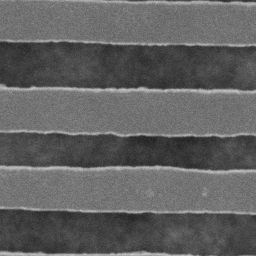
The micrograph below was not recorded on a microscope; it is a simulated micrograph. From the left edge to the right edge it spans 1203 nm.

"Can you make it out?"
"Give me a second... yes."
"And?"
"lines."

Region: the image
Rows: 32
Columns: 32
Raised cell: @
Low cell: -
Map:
@@@@@@@@@@@@@@@@@@@@@@@@@@@@@@@@
@@@@@@@@@@@@@@@@@@@@@@@@@@@@@@@@
@@@@@@@@@@@@@@@@@@@@@@@@@@@@@@@@
@@@@@@@@@@@@@@@@@@@@@@@@@@@@@@@@
@@@@@@@@@@@@@@@@@@@@@@@@@@@@@@@@
--------------@@@@@@@@@@@@@@@@@@
--------------------------------
--------------------------------
--------------------------------
--------------------------------
--------------------------------
@@@@@@@@@@@@@@@@@@@@@@@@@@@@@@@@
@@@@@@@@@@@@@@@@@@@@@@@@@@@@@@@@
@@@@@@@@@@@@@@@@@@@@@@@@@@@@@@@@
@@@@@@@@@@@@@@@@@@@@@@@@@@@@@@@@
@@@@@@@@@@@@@@@@@@@@@@@@@@@@@@@@
----@@@@@@@@@@@@@@@@@@@@@@@@@@@@
--------------------------------
--------------------------------
--------------------------------
--------------------------------
@@@@@@@@@@@@@@@@@@@@@@@@@@@@@@@@
@@@@@@@@@@@@@@@@@@@@@@@@@@@@@@@@
@@@@@@@@@@@@@@@@@@@@@@@@@@@@@@@@
@@@@@@@@@@@@@@@@@@@@@@@@@@@@@@@@
@@@@@@@@@@@@@@@@@@@@@@@@@@@@@@@@
----------------@@-@@@@@@@@@@@@@
--------------------------------
--------------------------------
--------------------------------
--------------------------------
--------------------------------